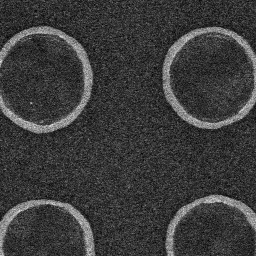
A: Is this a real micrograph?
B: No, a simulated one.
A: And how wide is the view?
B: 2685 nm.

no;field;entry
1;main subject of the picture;raised bodies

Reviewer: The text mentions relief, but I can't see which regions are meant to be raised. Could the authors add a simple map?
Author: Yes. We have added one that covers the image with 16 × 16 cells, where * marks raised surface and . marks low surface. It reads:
................
................
.***.......****.
*****......*****
******....******
*****.....******
*****......*****
.***........***.
................
................
................
................
.............*..
.****......*****
*****......*****
******.....*****